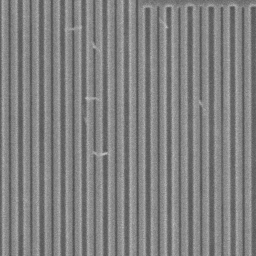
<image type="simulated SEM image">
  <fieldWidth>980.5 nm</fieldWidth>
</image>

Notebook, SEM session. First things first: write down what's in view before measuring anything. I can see parallel lines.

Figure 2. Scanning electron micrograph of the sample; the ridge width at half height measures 26.8 nm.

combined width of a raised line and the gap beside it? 40.3 nm